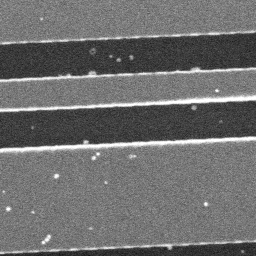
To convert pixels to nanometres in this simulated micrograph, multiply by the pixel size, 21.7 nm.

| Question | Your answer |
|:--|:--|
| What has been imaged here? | lines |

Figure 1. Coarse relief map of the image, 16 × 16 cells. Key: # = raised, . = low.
################
################
######..........
................
..........######
################
###########.....
................
................
################
################
################
################
################
################
########........